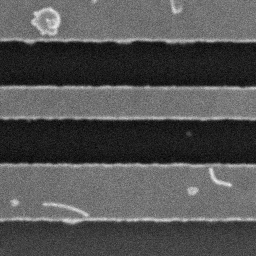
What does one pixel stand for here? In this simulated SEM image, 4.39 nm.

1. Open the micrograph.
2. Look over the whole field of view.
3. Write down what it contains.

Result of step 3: lines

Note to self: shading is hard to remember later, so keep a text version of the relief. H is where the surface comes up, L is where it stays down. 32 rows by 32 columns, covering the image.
HHHHHHHHHHHHHHHHHHHHHHHHHHHHHHHH
HHHHHHHHHHHHHHHHHHHHHHHHHHHHHHHH
HHHHHHHHHHHHHHHHHHHHHHHHHHHHHHHH
HHHHHHHHHHHHHHHHHHHHHHHHHHHHHHHH
HHHHHHHHHHHHHHHHHHHHHHHHHHHHHHHH
LLLLLLLLLLLLLLLLLLLLLLLLLLLLLLLL
LLLLLLLLLLLLLLLLLLLLLLLLLLLLLLLL
LLLLLLLLLLLLLLLLLLLLLLLLLLLLLLLL
LLLLLLLLLLLLLLLLLLLLLLLLLLLLLLLL
LLLLLLLLLLLLLLLLLLLLLLLLLLLLLLLL
LLLLLLLLLLLLLLLLLLLLLLLLLLLLLLLL
HHHHHHHHHHHHHHHHHHHHHHHHHHHHHHHH
HHHHHHHHHHHHHHHHHHHHHHHHHHHHHHHH
HHHHHHHHHHHHHHHHHHHHHHHHHHHHHHHH
HHHHHHHHHHHHHHHHHHHHHHHHHHHHHHHH
LLLLLLLLLLLLLLLLLLLLLLLLLLLLLLLL
LLLLLLLLLLLLLLLLLLLLLLLLLLLLLLLL
LLLLLLLLLLLLLLLLLLLLLLLLLLLLLLLL
LLLLLLLLLLLLLLLLLLLLLLLLLLLLLLLL
LLLLLLLLLLLLLLLLLLLLLLLLLLLLLLLL
LLLLLLLLLLLLLLLLLLLLLLLLLLLLLLLL
HHHHHHHHHHHHHHHHHHHHHHHHHHHHHHHH
HHHHHHHHHHHHHHHHHHHHHHHHHHHHHHHH
HHHHHHHHHHHHHHHHHHHHHHHHHHHHHHHH
HHHHHHHHHHHHHHHHHHHHHHHHHHHHHHHH
HHHHHHHHHHHHHHHHHHHHHHHHHHHHHHHH
HHHHHHHHHHHHHHHHHHHHHHHHHHHHHHHH
LLLLHLHLLHHLLLHHHLLHHHHHLLHLLLLL
LLLLLLLLLLLLLLLLLLLLLLLLLLLLLLLL
LLLLLLLLLLLLLLLLLLLLLLLLLLLLLLLL
LLLLLLLLLLLLLLLLLLLLLLLLLLLLLLLL
LLLLLLLLLLLLLLLLLLLLLLLLLLLLLLLL